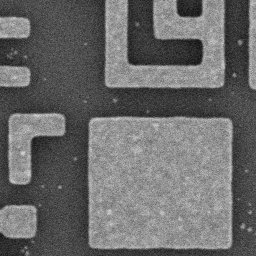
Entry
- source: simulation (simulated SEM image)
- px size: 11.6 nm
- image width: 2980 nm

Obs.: wiring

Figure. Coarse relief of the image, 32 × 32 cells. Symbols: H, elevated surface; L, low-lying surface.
LLLLLLLLLLLLLHHHLLLHHHLLLHHHLLLH
LLLLLLLLLLLLLHHHLLLHHHLLLHHHLLLH
HHHLLLLLLLLLLHHHLLLHHHHHHHHHLLLH
HHHHLLLLLLLLLHHHLLLHHHHHHHHHLLLH
HHHLLLLLLLLLLHHHLLLHHHHHHHHHLLLH
LLLLLLLLLLLLLHHHLLLLLLLLLHHHLLLH
LLLLLLLLLLLLLHHHLLLLLLLLLHHHLLLH
LLLLLLLLLLLLLHHHLLLLLLLLLHHHLLLH
HHHLLLLLLLLLLHHHHHHHHHHHHHHHLLLH
HHHHLLLLLLLLLHHHHHHHHHHHHHHHLLLH
HHHLLLLLLLLLLHHHHHHHHHHHHHHHLLLH
LLLLLLLLLLLLLLLLLLLLLLLLLLLLLLLL
LLLLLLLLLLLLLLLLLLLLLLLLLLLLLLLL
LLLLLLLLLLLLLLLLLLLLLLLLLLLLLLLL
LHHHHHHHLLLLLLLLLLLLLLLLLLLLLLLL
LHHHHHHHLLLHHHHHHHHHHHHHHHHHHLLL
LHHHHHHHLLLHHHHHHHHHHHHHHHHHHLLL
LHHHLLLLLLLHHHHHHHHHHHHHHHHHHLLL
LHHHLLLLLLLHHHHHHHHHHHHHHHHHHLLL
LHHHLLLLLLLHHHHHHHHHHHHHHHHHHLLL
LHHHLLLLLLLHHHHHHHHHHHHHHHHHHLLL
LHHHLLLLLLLHHHHHHHHHHHHHHHHHHLLL
LHHHLLLLLLLHHHHHHHHHHHHHHHHHHLLL
LLLLLLLLLLLHHHHHHHHHHHHHHHHHHLLL
LLLLLLLLLLLHHHHHHHHHHHHHHHHHHLLL
LLLLLLLLLLLHHHHHHHHHHHHHHHHHHLLL
HHHHLLLLLLLHHHHHHHHHHHHHHHHHHLLL
HHHHLLLLLLLHHHHHHHHHHHHHHHHHHLLL
HHHHLLLLLLLHHHHHHHHHHHHHHHHHHLLL
LHHHLLLLLLLHHHHHHHHHHHHHHHHHHLLL
LLLLLLLLLLLHHHHHHHHHHHHHHHHHHLLL
LLLLLLLLLLLLLLLLLLLLLLLLLLLLLLLL